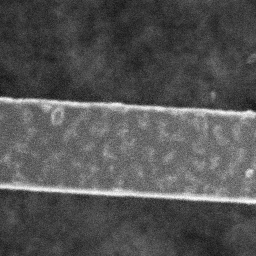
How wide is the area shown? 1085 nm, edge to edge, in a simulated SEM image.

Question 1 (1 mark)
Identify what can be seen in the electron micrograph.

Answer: one or a few lines or trenches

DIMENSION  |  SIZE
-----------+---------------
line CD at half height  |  378 nanometres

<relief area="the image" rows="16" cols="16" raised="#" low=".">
................
................
................
................
................
................
######..........
################
################
################
################
################
..............##
................
................
................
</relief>